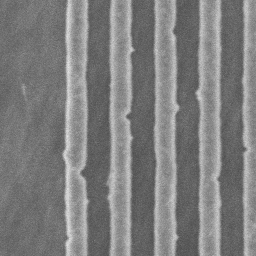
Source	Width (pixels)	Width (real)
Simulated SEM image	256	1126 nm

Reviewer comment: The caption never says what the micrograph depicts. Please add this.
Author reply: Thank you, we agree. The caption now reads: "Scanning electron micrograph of parallel lines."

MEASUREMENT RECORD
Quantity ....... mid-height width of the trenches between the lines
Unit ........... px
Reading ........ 24.9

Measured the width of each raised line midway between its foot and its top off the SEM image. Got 19.4 pixels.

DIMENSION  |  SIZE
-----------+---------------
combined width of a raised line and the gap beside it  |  0.195 micrometres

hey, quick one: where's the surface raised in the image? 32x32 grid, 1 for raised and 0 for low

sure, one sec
00000000011000110001110001100001
00000000111000110000110001110001
00000000111000110001110001100001
00000000111000110001110001100001
00000000111000110001110001100001
00000000111000110001110001100001
00000000111000110001110001100011
00000000111000110001110001100011
00000000111000110001110001100011
00000000111000110000110001100011
00000000111000110001110001100011
00000000111000110000110001100001
00000000111000110000110001100011
00000000111000110000110001100011
00000000111000110001110001100011
00000000111000110001110001100001
00000000111000110001110001100001
00000000111000110000110001100001
00000000111000110000110001100001
00000000111000110000110001100001
00000000111000110000110001100001
00000000110000110000110001100001
00000000111000110000110001100001
00000000111000110000110001100001
00000000111000110000110001100001
00000000111000110000110001100001
00000000111000110001110001100001
00000000111000110000110001100001
00000000111000110001110001100001
00000000011000110001110001100001
00000000111000110001110001100001
00000000111000110001110001100001